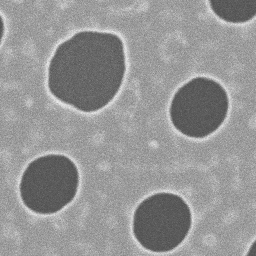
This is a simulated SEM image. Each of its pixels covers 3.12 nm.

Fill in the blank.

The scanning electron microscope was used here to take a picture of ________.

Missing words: holes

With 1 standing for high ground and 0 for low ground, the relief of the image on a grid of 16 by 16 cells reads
1111111111111000
1111111111111111
1111000111111111
1110000011111111
1110000011111111
1110000111100011
1111000111100011
1111111111100011
1111111111110111
1111111111111111
1100011111111111
1000011111111111
1000111110011111
1111111100001111
1111111100001111
1111111110011111